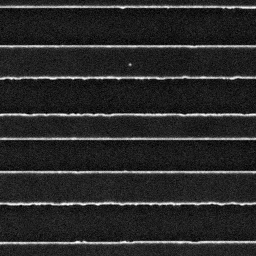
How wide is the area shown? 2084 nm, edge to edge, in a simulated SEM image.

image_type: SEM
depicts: lines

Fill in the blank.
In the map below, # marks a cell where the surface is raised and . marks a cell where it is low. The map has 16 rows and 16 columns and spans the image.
................
................
................
################
################
................
................
################
################
................
................
################
################
................
................
################